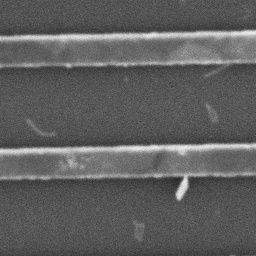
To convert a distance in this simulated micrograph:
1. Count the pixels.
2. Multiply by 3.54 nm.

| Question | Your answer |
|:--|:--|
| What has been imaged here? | lines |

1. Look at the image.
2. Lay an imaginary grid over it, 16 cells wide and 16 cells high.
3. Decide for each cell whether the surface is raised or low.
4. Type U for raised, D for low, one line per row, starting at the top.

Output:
DDDDDDDDDDDDDDDD
DDDDDDDDDDDDDDDD
UUUUUUUUUUUUUUUU
UUUUUUUUUUUUUUUU
DDDDDDDDDDDDDDDD
DDDDDDDDDDDDDDDD
DDDDDDDDDDDDDDDD
DDDDDDDDDDDDDDDD
DDDDDDDDDDDDDDDD
UUUUUUUUUUUUUUUU
UUUUUUUUUUUUUUUU
DDDDDDDDDDDDDDDD
DDDDDDDDDDDDDDDD
DDDDDDDDDDDDDDDD
DDDDDDDDDDDDDDDD
DDDDDDDDDDDDDDDD